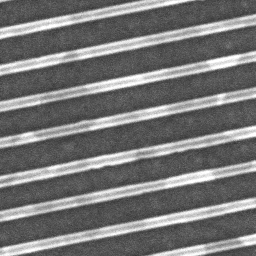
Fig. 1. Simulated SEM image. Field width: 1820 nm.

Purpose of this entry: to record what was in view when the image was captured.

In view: parallel lines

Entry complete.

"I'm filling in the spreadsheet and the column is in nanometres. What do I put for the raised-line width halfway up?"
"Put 58.4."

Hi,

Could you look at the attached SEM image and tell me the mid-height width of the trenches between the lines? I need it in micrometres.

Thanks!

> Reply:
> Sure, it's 0.194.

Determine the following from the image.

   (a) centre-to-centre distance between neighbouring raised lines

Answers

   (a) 255 nm